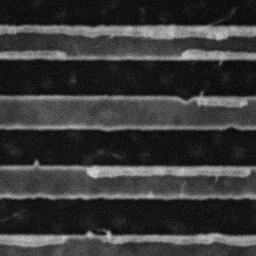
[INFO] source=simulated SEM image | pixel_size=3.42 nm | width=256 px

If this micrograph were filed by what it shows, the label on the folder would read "one or a few lines or trenches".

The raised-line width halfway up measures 106 nm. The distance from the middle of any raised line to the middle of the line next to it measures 238 nanometers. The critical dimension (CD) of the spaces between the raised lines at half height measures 132 nanometers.